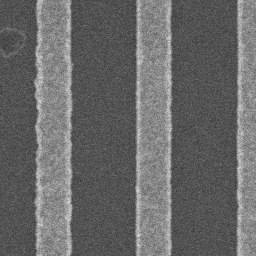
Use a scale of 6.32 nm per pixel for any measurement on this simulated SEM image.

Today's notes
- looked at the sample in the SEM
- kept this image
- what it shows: one or a few lines or trenches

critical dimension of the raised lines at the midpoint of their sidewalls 193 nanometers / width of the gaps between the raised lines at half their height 0.443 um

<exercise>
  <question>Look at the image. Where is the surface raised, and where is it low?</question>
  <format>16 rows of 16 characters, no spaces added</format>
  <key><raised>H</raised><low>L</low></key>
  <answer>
LLHHLLLLLHHLLLLH
LLHHLLLLLHHLLLLH
LLHHLLLLLHHLLLLH
LLHHLLLLLHHLLLLH
LLHHLLLLLHHLLLLH
LLHHLLLLLHHLLLLH
LLHHLLLLLHHLLLLH
LLHHLLLLLHHLLLLH
LLHHLLLLLHHLLLLH
LLHHLLLLLHHLLLLH
LLHHLLLLLHLLLLLH
LLHHLLLLLHHLLLLH
LLHHLLLLLHHLLLLH
LLHHLLLLLHHLLLLH
LLHHLLLLLHHLLLLH
LLHHLLLLLHHLLLLH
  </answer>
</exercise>